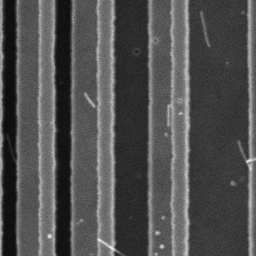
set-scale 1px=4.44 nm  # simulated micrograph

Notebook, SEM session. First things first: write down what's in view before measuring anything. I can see lines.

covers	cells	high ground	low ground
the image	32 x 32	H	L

LLHHHHHLLHHHHHLLLLLHHHHLLLLLLLLH
LLHHHHHLLHHHHHLLLLLHHHHLLLLLLLLH
LLHHHHHLLHHHHHLLLLLHHHHLLLLLLLLH
LLHHHHHLLHHHHHLLLLLHHHHLLLLLLLLH
LLHHHHHLLHHHHHLLLLLHHHHLLLLLLLLH
LLHHHHHLLHHHHHLLLLLHHHHLLLLLLLLH
LLHHHHHLLHHHHHLLLLLHHHHLLLLLLLLH
LLHHHHHLLHHHHHLLLLLHHHHLLLLLLLLH
LLHHHHHLLHHHHHLLLLLHHHHLLLLLLLLH
LLHHHHHLLHHHHHLLLLLHHHHLLLLLLLLH
LLHHHHHLLHHHHHLLLLLHHHHLLLLLLLLH
LLHHHHHLLHHHHHLLLLLHHHHLLLLLLLLH
LLHHHHHLLHHHHHLLLLLHHHHLLLLLLLLH
LLHHHHHLLHHHHHLLLLLHHHHLLLLLLLLH
LLHHHHHLLHHHHHLLLLLHHHHLLLLLLLLH
LLHHHHHLLHHHHHLLLLLHHHHLLLLLLLLH
LLHHHHHLLHHHHHLLLLLHHHHLLLLLLLLH
LLHHHHHLLHHHHHLLLLLHHHHLLLLLLLLH
LLHHHHHLLHHHHHLLLLLHHHHLLLLLLLLH
LLHHHHHLLHHHHHLLLLLHHHHLLLLLLLLH
LLHHHHHLLHHHHHLLLLLHHHHLLLLLLLLH
LLHHHHHLLHHHHHLLLLLHHHHLLLLLLLLH
LLHHHHHLLHHHHHLLLLLHHHHLLLLLLLLH
LLHHHHHLLHHHHHLLLLLHHHHLLLLLLLLH
LLHHHHHLLHHHHHLLLLLHHHHLLLLLLLLH
LLHHHHHLLHHHHHLLLLLHHHHLLLLLLLLH
LLHHHHHLLHHHHHLLLLLHHHHLLLLLLLLH
LLHHHHHLLHHHHHLLLLLHHHHLLLLLLLLH
LLHHHHHLLHHHHHLLLLLHHHHLLLLLLLLH
LLHHHHHLLHHHHHLLLLLHHHHLLLLLLLLH
LLHHHHHLLHHHHHLLLLLHHHHLLLLLLLLH
LLHHHHHLLHHHHHLLLLLHHHHLLLLLLLLH